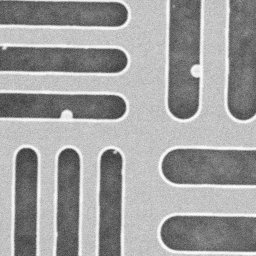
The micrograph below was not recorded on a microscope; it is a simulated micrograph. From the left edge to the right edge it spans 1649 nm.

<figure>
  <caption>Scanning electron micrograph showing groups of lines, slits or small figures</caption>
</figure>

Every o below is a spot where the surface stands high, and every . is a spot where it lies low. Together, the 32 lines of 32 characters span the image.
...............oooooo....ooo....
................ooooo....ooo....
................ooooo....ooo....
ooooooooooooooooooooo....ooo....
ooooooooooooooooooooo....ooo....
ooooooooooooooooooooo....ooo....
................ooooo....ooo....
................ooooo....ooo....
................ooooo....ooo....
ooooooooooooooooooooo....ooo....
ooooooooooooooooooooo....ooo....
.....oooooooooooooooo....ooo....
................ooooo....ooo....
................ooooo....ooo....
...............ooooooo..ooooo...
oooooooooooooooooooooooooooooooo
oooooooooooooooooooooooooooooooo
oooooooooooooooooooooooooooooooo
ooo.oooo.ooooooooooooo.......ooo
oo...oo...ooo..ooooo............
oo...oo...oo...ooooo............
oo...oo...oo...ooooo............
oo...oo...oo...oooooo...........
oo...oo...oo...ooooooooooooooooo
oo...oo...oo...ooooooooooooooooo
oo...oo...oo...ooooooooooooooooo
oo...oo...oo...ooooooooooooooooo
oo...oo...oo...oooooo...........
oo...oo...oo...ooooo............
oo...oo...oo...ooooo............
oo...oo...oo...ooooo............
oo...oo...oo...ooooooo..........